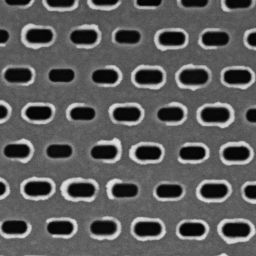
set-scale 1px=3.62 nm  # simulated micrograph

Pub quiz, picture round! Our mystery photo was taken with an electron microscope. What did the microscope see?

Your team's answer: a regular array of holes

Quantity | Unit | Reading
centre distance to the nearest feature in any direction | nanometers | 157